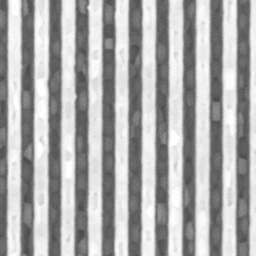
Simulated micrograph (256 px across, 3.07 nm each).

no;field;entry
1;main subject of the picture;parallel lines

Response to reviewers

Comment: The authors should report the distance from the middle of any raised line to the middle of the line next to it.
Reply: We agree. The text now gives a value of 82.6 nm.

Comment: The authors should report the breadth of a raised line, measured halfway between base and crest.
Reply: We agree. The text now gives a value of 37.6 nm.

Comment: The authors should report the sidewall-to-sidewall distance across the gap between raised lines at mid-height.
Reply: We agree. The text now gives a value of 43.4 nm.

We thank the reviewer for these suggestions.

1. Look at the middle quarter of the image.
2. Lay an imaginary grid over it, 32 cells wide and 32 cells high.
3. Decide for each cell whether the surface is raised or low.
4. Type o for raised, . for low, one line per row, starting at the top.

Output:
ooo...ooo....ooo....ooo....ooo..
oo....ooo....ooo....ooo....ooo..
ooo...ooo....ooo....ooo....ooo..
ooo...ooo....ooo....ooo....oo...
ooo...ooo....ooo....ooo....oo...
ooo...ooo....ooo....ooo....oo...
ooo....oo....ooo....ooo....ooo..
ooo...ooo....ooo....ooo....ooo..
ooo...ooo....ooo....ooo....oo...
ooo...ooo....ooo....ooo....oo...
ooo...ooo....ooo....ooo....oo...
ooo...ooo....ooo....ooo....oo...
oo....ooo....ooo....ooo....oo...
oo....ooo....ooo....ooo....oo...
oo.....oo....ooo....ooo....oo...
oo....ooo....ooo....ooo....oo...
oo....ooo....ooo....ooo...ooo...
oo....ooo....ooo....ooo...ooo...
oo....ooo....ooo....ooo...oooo..
oo....ooo....ooo....ooo...oooo..
oo....ooo....ooo....oo....ooo...
oo....ooo....ooo....oo....ooo...
oo....ooo....ooo....oo....ooo...
oo....ooo....ooo....ooo...oooo..
oo....ooo....ooo....ooo...ooo...
oo....ooo....ooo....ooo...ooo...
oo....ooo....ooo....ooo...ooo...
oo....ooo....ooo....ooo...ooo...
oo....ooo....ooo....ooo...ooo...
oo....ooo....ooo....ooo...oooo..
oo....ooo....ooo....ooo...ooo...
oo....ooo....ooo....oo....ooo...